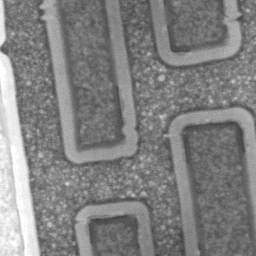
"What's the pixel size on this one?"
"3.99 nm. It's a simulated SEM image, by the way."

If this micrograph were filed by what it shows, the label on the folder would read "one or a few lines or trenches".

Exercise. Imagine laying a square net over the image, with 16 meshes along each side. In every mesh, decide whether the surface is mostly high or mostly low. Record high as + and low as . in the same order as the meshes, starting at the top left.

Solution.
...++++...++++..
...++++...+++++.
...++++...+++++.
....++++...++...
....++++........
....++++........
+...++++........
+...++++....+++.
+...++++...+++++
+....++....+++++
+..........+++++
+..........+++++
+...........++++
++...++++...++++
++...++++...++++
++...++++...++++